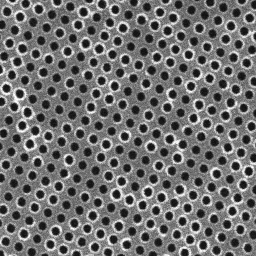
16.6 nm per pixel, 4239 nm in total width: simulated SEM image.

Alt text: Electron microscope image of a regular array of holes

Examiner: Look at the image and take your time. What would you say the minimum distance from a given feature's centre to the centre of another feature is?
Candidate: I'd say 232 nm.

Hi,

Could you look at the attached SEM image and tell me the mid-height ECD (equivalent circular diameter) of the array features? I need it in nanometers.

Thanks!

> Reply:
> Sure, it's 153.